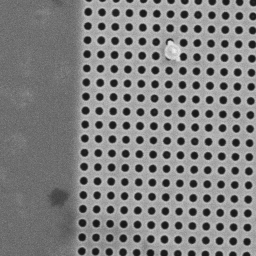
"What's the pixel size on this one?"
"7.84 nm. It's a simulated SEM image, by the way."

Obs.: a regular array of holes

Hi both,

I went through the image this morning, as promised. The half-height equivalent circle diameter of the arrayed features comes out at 63.1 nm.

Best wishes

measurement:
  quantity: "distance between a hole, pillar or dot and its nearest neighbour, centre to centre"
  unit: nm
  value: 106